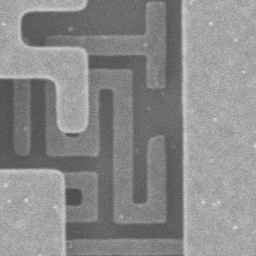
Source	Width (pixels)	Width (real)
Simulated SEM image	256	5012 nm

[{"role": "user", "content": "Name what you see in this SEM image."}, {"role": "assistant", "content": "wiring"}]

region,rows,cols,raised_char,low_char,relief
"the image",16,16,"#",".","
#####......#####
#..........#####
#..........#####
#####......#####
#####......#####
...##......#####
....#......#####
....#......#####
...........#####
...........#####
...........#####
####.......#####
####........####
####........####
####........####
####........####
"